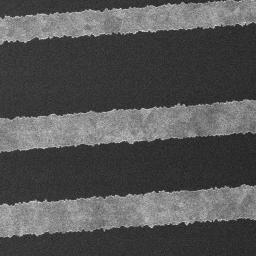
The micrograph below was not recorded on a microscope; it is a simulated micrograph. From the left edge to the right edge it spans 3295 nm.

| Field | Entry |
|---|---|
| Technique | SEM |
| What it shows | one or a few lines or trenches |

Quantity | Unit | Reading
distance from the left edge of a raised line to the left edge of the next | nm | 1220